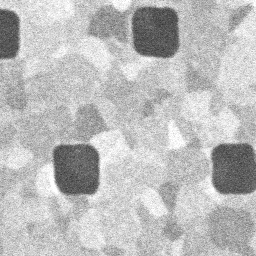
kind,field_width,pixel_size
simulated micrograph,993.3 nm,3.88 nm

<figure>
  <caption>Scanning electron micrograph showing holes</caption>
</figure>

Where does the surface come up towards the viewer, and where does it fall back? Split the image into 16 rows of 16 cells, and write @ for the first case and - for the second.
@@@@@@@@@--@@@@@
-@@@@@@@---@@@@@
-@@@@@@@---@@@@@
-@@@@@@@@--@@@@@
@@@@@@@@@@@@@@@@
@@@@@@@@@@@@@@@@
@@@@@@@@@@@@@@@@
@@@@@@@@@@@@@@@@
@@@@@@@@@@@@@@@@
@@@---@@@@@@@---
@@@---@@@@@@@---
@@@---@@@@@@@---
@@@@@@@@@@@@@@@@
@@@@@@@@@@@@@@@@
@@@@@@@@@@@@@@@@
@@@@@@@@@@@@@@@@